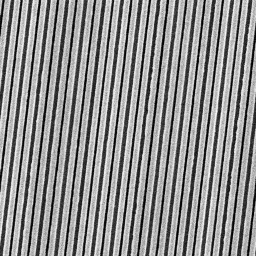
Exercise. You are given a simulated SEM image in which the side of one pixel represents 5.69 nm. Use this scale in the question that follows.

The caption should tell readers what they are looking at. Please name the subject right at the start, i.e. parallel lines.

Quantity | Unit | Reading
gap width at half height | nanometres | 20.5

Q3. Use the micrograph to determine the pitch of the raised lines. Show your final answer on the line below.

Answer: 0.0516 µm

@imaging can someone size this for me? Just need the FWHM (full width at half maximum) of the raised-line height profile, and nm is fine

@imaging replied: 31